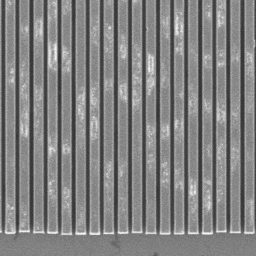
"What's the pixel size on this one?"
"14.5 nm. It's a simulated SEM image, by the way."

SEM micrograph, parallel lines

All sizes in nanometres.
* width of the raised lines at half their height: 143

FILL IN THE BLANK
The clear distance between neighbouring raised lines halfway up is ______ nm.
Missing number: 65.2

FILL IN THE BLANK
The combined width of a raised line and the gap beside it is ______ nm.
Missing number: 204